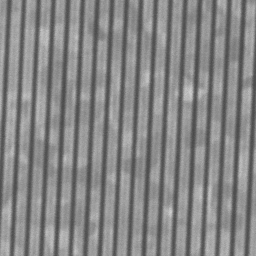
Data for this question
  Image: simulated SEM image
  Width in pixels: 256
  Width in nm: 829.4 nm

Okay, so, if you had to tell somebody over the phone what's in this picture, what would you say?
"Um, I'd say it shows parallel lines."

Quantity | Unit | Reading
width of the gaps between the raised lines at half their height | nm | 21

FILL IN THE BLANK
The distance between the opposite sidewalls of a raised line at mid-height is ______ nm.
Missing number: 27.1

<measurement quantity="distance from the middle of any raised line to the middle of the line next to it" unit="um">0.0475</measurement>